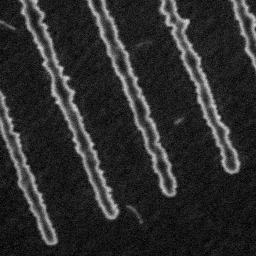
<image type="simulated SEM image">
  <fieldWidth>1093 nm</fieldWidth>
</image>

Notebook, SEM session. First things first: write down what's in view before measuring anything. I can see one or a few lines or trenches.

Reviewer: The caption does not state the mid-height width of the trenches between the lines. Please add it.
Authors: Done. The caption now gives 220 nm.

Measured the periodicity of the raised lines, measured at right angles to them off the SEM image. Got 279 nm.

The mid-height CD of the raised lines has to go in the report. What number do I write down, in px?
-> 12.7